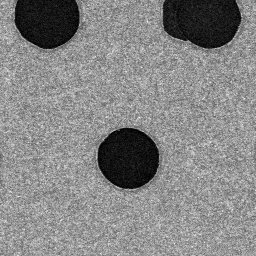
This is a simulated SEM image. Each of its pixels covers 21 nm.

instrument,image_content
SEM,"holes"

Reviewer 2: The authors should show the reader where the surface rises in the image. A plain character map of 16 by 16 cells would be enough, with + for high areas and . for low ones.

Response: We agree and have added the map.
+....+++++.....+
+....+++++.....+
++..+++++++...++
++++++++++++++++
++++++++++++++++
++++++++++++++++
++++++++++++++++
++++++++++++++++
+++++++..+++++++
++++++....++++++
++++++....++++++
+++++++..+++++++
++++++++++++++++
++++++++++++++++
++++++++++++++++
++++++++++++++++